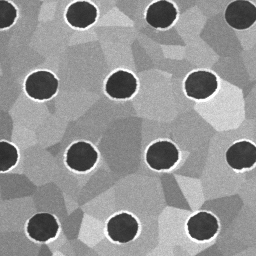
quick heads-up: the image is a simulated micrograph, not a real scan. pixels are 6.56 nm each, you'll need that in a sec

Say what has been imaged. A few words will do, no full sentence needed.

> a regular array of holes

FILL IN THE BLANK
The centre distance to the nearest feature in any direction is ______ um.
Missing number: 0.524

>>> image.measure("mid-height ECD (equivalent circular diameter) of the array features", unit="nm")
198